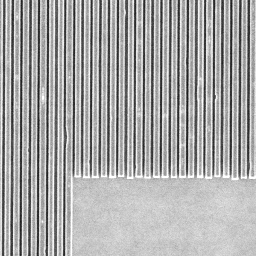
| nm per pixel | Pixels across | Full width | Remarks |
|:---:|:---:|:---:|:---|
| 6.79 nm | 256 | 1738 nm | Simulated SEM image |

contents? parallel lines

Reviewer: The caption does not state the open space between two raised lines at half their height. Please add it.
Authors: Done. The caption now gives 18.7 nm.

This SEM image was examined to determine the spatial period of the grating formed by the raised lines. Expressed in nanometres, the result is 59.4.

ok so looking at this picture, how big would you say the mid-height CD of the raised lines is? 0.0374 µm